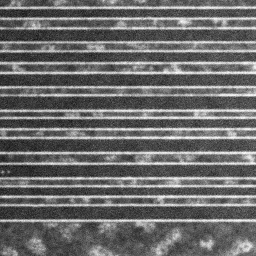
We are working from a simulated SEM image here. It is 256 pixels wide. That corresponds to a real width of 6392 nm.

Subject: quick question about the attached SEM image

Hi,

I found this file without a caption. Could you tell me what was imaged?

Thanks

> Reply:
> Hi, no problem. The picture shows parallel lines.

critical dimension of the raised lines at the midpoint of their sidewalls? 218 nanometers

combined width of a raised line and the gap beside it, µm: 0.553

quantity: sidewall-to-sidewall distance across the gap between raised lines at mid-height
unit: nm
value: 350